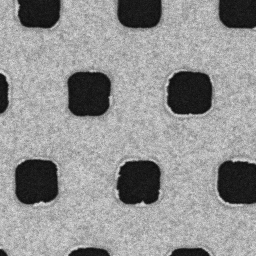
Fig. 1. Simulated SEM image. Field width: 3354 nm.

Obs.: holes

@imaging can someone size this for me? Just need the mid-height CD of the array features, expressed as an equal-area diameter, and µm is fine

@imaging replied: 0.612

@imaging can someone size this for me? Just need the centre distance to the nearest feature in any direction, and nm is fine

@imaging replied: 1330